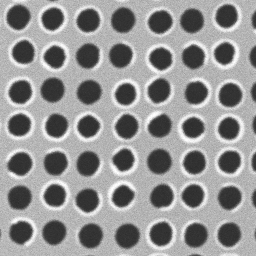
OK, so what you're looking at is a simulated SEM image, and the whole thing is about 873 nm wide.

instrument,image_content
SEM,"a regular array of holes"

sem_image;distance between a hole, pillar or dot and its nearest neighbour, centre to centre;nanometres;112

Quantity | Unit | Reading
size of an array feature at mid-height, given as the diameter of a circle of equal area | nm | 82.3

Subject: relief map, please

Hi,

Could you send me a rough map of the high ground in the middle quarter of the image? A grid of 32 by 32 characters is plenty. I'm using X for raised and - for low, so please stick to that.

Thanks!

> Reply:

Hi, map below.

XXXX----XXXX----XXXXXX-----XXX--
XXXXXXXXXXXXXXXXXXXXXXXX-XXXXXXX
XXXXXXXXXXXXXXXXXXXXXXXXXXXXXXXX
XXXXXXXXXXXXXXXXXXXXXXXXXXXXXXXX
XXXXX---XXXXXXXXXXXXXX----XXXXXX
XXXX-----XXXXX---XXXX------XXXX-
XXX-------XXX-----XXX------XXX--
XXX-------XXX-----XXX------XXX--
XXX------XXXX-----XXX-----XXXX--
XXXX----XXXXX----XXXXX---XXXXXX-
XXXXXXXXXXXXXXXXXXXXXXXXXXXXXXXX
XXXXXXXXXXXXXXXXXXXXXXXXXXXXXXXX
XXXXXXXXXXXXXXX-XXXXXXXX-XXXXXXX
XXXX----XXXXXX----XXXX----XXXXX-
-XXX-----XXXX------XX------XXX--
-XX------XXXX------XX------XX---
-XX------XXXX------XX------XXX--
XXXX----XXXXX-----XXXX----XXXX--
XXXXX-XXXXXXXX---XXXXXXXXXXXXXXX
XXXXXXXXXXXXXXXXXXXXXXXXXXXXXXXX
XXXXXXXXXXXXXXXXXXXXXXXXXXXXXXXX
XXXXXXXXXXXXXX---XXXXX---XXXXXXX
XXXX----XXXXX----XXXX-----XXXXX-
-XXX-----XXX------XXX------XXX--
-XX------XXX------XXX------XXX--
-XX------XXXX----XXXX------XXX--
XXX-----XXXXX---XXXXXX----XXXX--
XXXX----XXXXXXXXXXXXXXX-XXXXXXX-
XXXXXXXXXXXXXXXXXXXXXXXXXXXXXXXX
XXXXXXXXXXXXXXXXXXXXXXXXXXXXXXXX
XXXXXXXXXXXXXX--XXXXXXX---XXXXX-
XXXXX---XXXXX----XXXXX-----XXX--